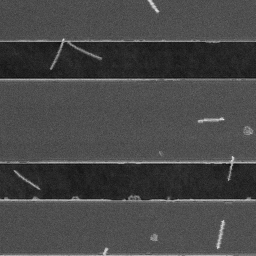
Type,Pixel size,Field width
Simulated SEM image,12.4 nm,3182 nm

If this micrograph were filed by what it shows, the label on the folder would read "lines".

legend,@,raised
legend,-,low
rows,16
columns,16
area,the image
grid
@@@@@@@@@@@@@@@@
@@@@@@@@@@@@@@@@
@@@@@@@@@@@@@@@@
----------------
----------------
@@@@@@@@@@@@@@@@
@@@@@@@@@@@@@@@@
@@@@@@@@@@@@@@@@
@@@@@@@@@@@@@@@@
@@@@@@@@@@@@@@@@
----------------
----------------
----------------
@@@@@@@@@@@@@@@@
@@@@@@@@@@@@@@@@
@@@@@@@@@@@@@@@@